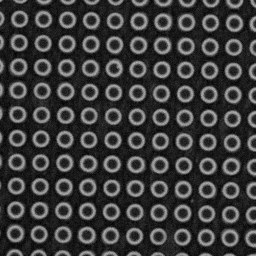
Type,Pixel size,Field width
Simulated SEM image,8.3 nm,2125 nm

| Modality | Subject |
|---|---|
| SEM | an array of small figures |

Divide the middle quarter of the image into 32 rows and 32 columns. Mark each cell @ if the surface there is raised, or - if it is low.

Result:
@@@--@@@@--@@@---@@@---@@@---@@@
@@@--@@@@--@@@@--@@@---@@@--@@@@
@@---@@@---@@@---@@@---@@@---@@@
------------------------------@-
--------------------------------
@@---@@@---@@@---@@@---@@-----@-
@@---@@@---@@@---@@@---@@@---@@@
@@---@@@---@@@--@@@@--@@@@--@@@@
@@---@@@---@@@---@@@---@@@---@@@
--------------------------------
--------------------------------
@@---@@@---@@@---@@----@@-----@-
@@--@@@@--@@@@--@@@@--@@@@--@@@@
@@--@@@@--@@@@--@@@@--@@@@--@@@@
@@---@@@---@@@---@@@--@@@@--@@@@
--------------------------------
--------------------------------
@@---@@@---@@@---@@----@@----@@-
@@--@@@@--@@@@--@@@@--@@@@--@@@@
@@--@@@@--@@@@--@@@@--@@@@--@@@@
@----@@@---@@@--@@@@--@@@@--@@@@
--------------------------------
--------------------------------
@@---@@@---@@@---@@----@@----@@-
@@--@@@@--@@@@--@@@@--@@@@--@@@@
@@--@@@@--@@@@--@@@@--@@@@--@@@@
@----@@----@@---@@@@--@@@@--@@@@
--------------------------------
--------------------------------
@@--@@@@---@@----@@----@@----@@-
@@--@@@@--@@@@--@@@@--@@@@--@@@@
@@--@@@@--@@@@--@@@@--@@@@--@@@@